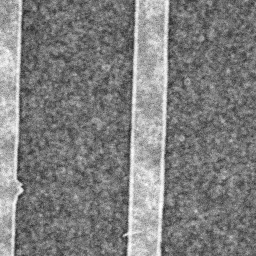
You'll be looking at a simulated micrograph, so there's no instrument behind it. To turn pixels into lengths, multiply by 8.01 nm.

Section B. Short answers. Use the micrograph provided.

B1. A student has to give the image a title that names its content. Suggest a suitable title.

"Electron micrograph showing one or a few lines or trenches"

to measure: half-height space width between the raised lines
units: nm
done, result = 934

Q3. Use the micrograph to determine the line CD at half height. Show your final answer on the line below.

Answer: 0.242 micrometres